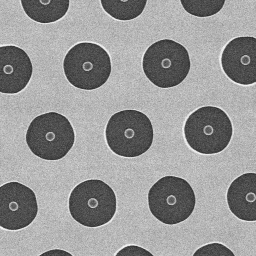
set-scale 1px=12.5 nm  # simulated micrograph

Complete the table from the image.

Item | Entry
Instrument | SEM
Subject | an array of small figures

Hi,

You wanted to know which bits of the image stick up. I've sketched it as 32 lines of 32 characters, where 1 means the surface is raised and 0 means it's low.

11100000011110000011111000001111
11100000111110000011111000011111
11110001111111101111111111111111
11111111111111111111111111111111
11111111111111111111111111111111
11111111110011111110000111110000
00011111000001111100000111110000
00001111000000111100000011110000
00001111000000111100000011110000
00001111000000111100000111110000
00011111100001111110001111111100
00111111111111111111111111111111
11111111111111111111111111111111
11111111111111111111111110011111
11111000111111000011111100001111
11110000011110000001111000000111
11100000011110000001111000000111
11100000011110000001111000000111
11110000011111000001111100001111
11111000111111100111111111111111
11111111111111111111111111111111
11111111111111111111111111111111
11111111111011111111000111111000
00001111100000111110000011111000
00001111100000111100000011110000
00000111100000011110000011110000
00000111100000111110000011111000
00001111100000111111000111111100
00011111111111111111111111111111
11111111111111111111111111111111
11111111111111111111111111001111
11111100111111100001111100000111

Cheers